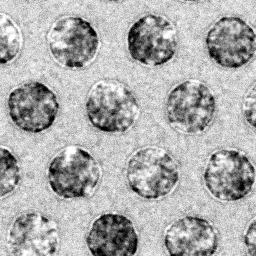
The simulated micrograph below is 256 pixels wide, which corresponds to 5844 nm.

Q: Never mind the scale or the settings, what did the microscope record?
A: holes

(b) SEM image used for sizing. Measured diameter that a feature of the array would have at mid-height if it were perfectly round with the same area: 51.3 px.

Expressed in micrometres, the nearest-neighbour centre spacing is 1.74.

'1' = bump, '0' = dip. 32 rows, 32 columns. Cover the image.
11111111111111111111111111111111
11111111111111111111111111111111
01111110000111111000011111100011
00111110000011110000001111000001
00011100000011110000001111000000
00011100000011110000001111000000
00111100000011110000001111000000
00111110000111111000011111100001
11111111101111111111111111110011
11111111111111111111111111111111
11100111111100011111110001111111
10000001111000001111100000111110
10000001111000000111100000011110
10000001111000000111100000011110
10000001111000000111100000011110
11000001111000000111100000111110
11100111111111011111111001111111
11111111111111111111111111111111
01111111001111111100111111111111
00111110000111110000011111000001
00111100000011110000001111000000
00011100000001110000001111000000
00111100000011110000001111000000
00111100000011110000001111000000
01111110000111111000011111100001
11111111111111111111111111111111
11111111111111111111111111111111
11000011111100001111110000111111
10000001111000000111100000011110
10000001111000000111100000011110
10000001111000000111100000011110
10000001111000000111100000011110